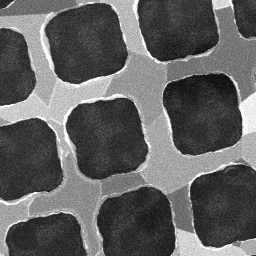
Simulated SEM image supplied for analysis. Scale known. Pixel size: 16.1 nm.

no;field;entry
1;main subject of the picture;holes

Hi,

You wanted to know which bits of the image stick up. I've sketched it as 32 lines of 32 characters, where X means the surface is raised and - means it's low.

-XXXXXXXXXX---XXX----------XX---
XXXXXXX--------XX----------XX---
XXXXXX---------XX----------XX---
--XXX----------XX----------XXX--
---XX----------XXX---------XXX--
---XXX----------XX---------XXXXX
----XX----------XXX-------XXXXXX
----XXX---------XXXX--XXXXXXXXXX
----XXX--------XXXXXXXXXXXXXXXXX
----XXX------XXXXXXXXXXX----XXXX
----XXXXX-XXXXXXXXXXX--------XXX
----XXXXXXXXXXXXXXXX----------XX
---XXXXXXXXX-X--XXXX----------XX
XXXXXXXXX--------XXXX---------XX
XXXXXXXXX--------XXXX---------XX
X-----XX----------XXX---------XX
-------X----------XXX---------XX
-------XX---------XXXX--------XX
--------X----------XXX------XXXX
--------X----------XXXXXXXXXXXXX
--------XX--------XXXXXXXXXXXXXX
--------XX-------XXXXXXXXXX-----
--------XXXXXXXXXXXXXXXX--------
-------XXXXXXXXXX---XXXX--------
----XXXXXXXXX--------XXX--------
XXXXXXXXXXXXX--------XXX--------
XXXXXXXXXXXX---------XXX--------
XXXX------XX----------XX--------
X---------XX----------XX--------
X---------XX----------XXX-------
X----------XX---------XXX----XXX
X----------XX---------XXXXXXXXXX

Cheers